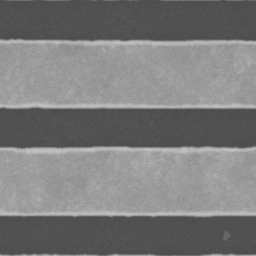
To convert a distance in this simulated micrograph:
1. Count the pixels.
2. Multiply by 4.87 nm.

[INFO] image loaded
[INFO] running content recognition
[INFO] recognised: lines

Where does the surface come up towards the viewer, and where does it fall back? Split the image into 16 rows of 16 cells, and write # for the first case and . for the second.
................
................
................
################
################
################
################
................
................
################
################
################
################
................
................
................